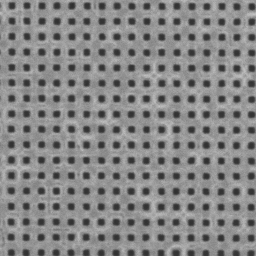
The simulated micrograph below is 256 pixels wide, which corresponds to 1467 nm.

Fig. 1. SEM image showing a regular array of holes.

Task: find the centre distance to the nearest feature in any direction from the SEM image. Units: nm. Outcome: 84.8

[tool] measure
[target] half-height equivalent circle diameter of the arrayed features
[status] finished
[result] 0.0424 um